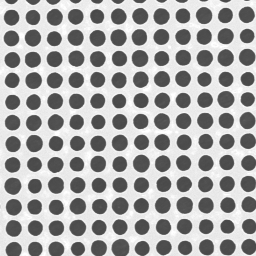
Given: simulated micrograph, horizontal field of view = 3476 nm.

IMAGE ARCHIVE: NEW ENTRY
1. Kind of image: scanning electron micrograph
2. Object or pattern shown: a regular array of holes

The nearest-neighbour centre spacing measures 282 nm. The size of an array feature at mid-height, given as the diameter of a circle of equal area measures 0.211 um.